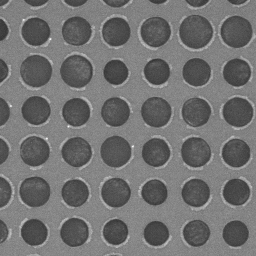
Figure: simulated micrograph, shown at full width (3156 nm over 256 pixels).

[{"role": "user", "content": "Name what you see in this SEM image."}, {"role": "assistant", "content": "a regular array of holes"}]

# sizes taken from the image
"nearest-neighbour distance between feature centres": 39.5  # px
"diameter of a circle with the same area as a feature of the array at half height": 359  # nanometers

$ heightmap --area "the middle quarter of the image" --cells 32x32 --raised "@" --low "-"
-------@@@------@@@@------@@@@--
-------@@@------@@@@-------@@@--
-------@@@------@@@@------@@@@--
-------@@@------@@@@------@@@@--
------@@@@@----@@@@@@-----@@@@@-
@----@@@@@@@@@@@@@@@@@@@@@@@@@@@
@@@@@@@@@@@@@@@@@@@@@@@@@@@@@@@@
@@@@@@@@@@@@@@@@@@@@@@@@@@@@@@@@
@@--@@@@@@@@--@@@@@@@----@@@@@@@
@-----@@@@------@@@@------@@@@--
------@@@@------@@@--------@@@--
------@@@-------@@@--------@@---
-------@@-------@@@--------@@---
------@@@@------@@@--------@@@--
@-----@@@@------@@@@------@@@@--
@@--@@@@@@@@--@@@@@@@----@@@@@@-
@@@@@@@@@@@@@@@@@@@@@@@@@@@@@@@@
@@@@@@@@@@@@@@@@@@@@@@@@@@@@@@@@
@@---@@@@@@----@@@@@@@-@@@@@@@@-
@-----@@@@------@@@@@----@@@@@--
-------@@--------@@@------@@@---
-------@@--------@@--------@@---
-------@@--------@@--------@@---
-------@@--------@@@------@@@---
------@@@@------@@@@------@@@@--
@@---@@@@@@---@@@@@@@@---@@@@@@-
@@@@@@@@@@@@@@@@@@@@@@@@@@@@@@@@
@@@@@@@@@@@@@@@@@@@@@@@@@@@@@@@@
@@@@@@@@@@@@--@@@@@@@@@@@@@@@@@@
@----@@@@@-----@@@@@@----@@@@@--
------@@@@------@@@@-----@@@@@--
------@@@--------@@-------@@@---